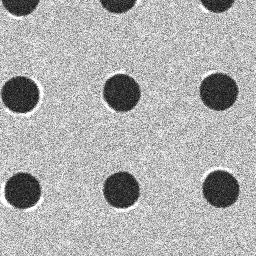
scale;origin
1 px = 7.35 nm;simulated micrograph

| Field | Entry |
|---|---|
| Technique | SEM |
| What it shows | holes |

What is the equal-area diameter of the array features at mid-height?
279 nm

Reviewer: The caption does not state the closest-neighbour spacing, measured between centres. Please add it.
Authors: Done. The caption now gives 0.715 micrometres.